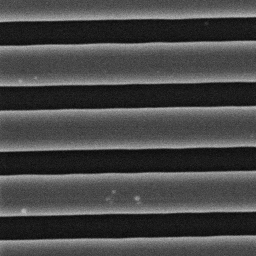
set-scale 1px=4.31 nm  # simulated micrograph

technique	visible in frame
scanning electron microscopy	groups of lines, slits or small figures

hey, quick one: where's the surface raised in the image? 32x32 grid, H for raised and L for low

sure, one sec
HHHHHHHHHHHHHHHHHHHHHHHHHHHHHHHH
HHHHHHHHHHHHHHHHHHHHHHHHHHHHHHHH
HHHHHHHHLLLLLLLLLLLLLLLLLLLLLLLL
LLLLLLLLLLLLLLLLLLLLLLLLLLLLLLLL
LLLLLLLLLLLLLLLLLLLLLLLLLLLLLLLL
LLLLLLLLLLLLLLLLLLHHHHHHHHHHHHHH
HHHHHHHHHHHHHHHHHHHHHHHHHHHHHHHH
HHHHHHHHHHHHHHHHHHHHHHHHHHHHHHHH
HHHHHHHHHHHHHHHHHHHHHHHHHHHHHHHH
HHHHHHHHHHHHHHHHHHHHHHHHHHHHHHHH
HHHHHHHHHHHHHHHHHLLLLLLLLLLLLLLL
LLLLLLLLLLLLLLLLLLLLLLLLLLLLLLLL
LLLLLLLLLLLLLLLLLLLLLLLLLLLLLLLL
LLLLLLLLLLLLLLLLLLLLLHHHHHHHHHHH
HHHHHHHHHHHHHHHHHHHHHHHHHHHHHHHH
HHHHHHHHHHHHHHHHHHHHHHHHHHHHHHHH
HHHHHHHHHHHHHHHHHHHHHHHHHHHHHHHH
HHHHHHHHHHHHHHHHHHHHHHHHHHHHHHHH
HHHHHHHHHHHHHHHHHHHHHHHHLLLLLLLL
LLLLLLLLLLLLLLLLLLLLLLLLLLLLLLLL
LLLLLLLLLLLLLLLLLLLLLLLLLLLLLLLL
LLLLLLLLLLLLLLLLLLLLLLLLLLLHHHHH
HHHHHHHHHHHHHHHHHHHHHHHHHHHHHHHH
HHHHHHHHHHHHHHHHHHHHHHHHHHHHHHHH
HHHHHHHHHHHHHHHHHHHHHHHHHHHHHHHH
HHHHHHHHHHHHHHHHHHHHHHHHHHHHHHHH
HHHHHHHHHHHHHHHHHHHHHHHHHHLLLLLL
LLLLLLLLLLLLLLLLLLLLLLLLLLLLLLLL
LLLLLLLLLLLLLLLLLLLLLLLLLLLLLLLL
LLLLLLLLLLLLLLLLLLLLLLLLLLLHHHHH
HHHHHHHHHHHHHHHHHHHHHHHHHHHHHHHH
HHHHHHHHHHHHHHHHHHHHHHHHHHHHHHHH